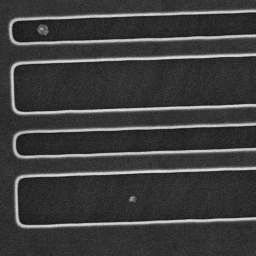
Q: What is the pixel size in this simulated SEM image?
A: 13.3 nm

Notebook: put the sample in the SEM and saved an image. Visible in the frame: groups of lines, slits or small figures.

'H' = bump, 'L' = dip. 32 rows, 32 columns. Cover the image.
HHHHHHHHHHHHHHHHHHHHHHHHHHHHHHHH
HHHHHHHHHHHHHHHHHHHHHHHHHHHLLLLL
HHLLLLLLLLLLLLLLLLLLLLLLLLLLLLLL
HLLLLLLLLLLLLLLLLLLLLLLLLLLLLLLL
HLLLLLLLLLLLLLLLLLLLLLLLLLLLLLLL
HHHHHHHHHHHHHHHHHHHHHHHHHHHHHHHH
HHHHHHHHHHHHHHHHHHHHHHHHHHHHHHHH
HHHHHHHHHHHHLLLLLLLLLLLLLLLLLLLL
HHLLLLLLLLLLLLLLLLLLLLLLLLLLLLLL
HHLLLLLLLLLLLLLLLLLLLLLLLLLLLLLL
HHLLLLLLLLLLLLLLLLLLLLLLLLLLLLLL
HHLLLLLLLLLLLLLLLLLLLLLLLLLLLLLL
HHLLLLLLLLLLLLLLLLLLLLLLLLLLLLLL
HHLLLLLLLLLLLLLLLLLLLLLLHHHHHHHH
HHHHHHHHHHHHHHHHHHHHHHHHHHHHHHHH
HHHHHHHHHHHHHHHHHHHHHHHHHHHHHHHH
HHHHLLLLLLLLLLLLLLLLLLLLLLLLLLLL
HHLLLLLLLLLLLLLLLLLLLLLLLLLLLLLL
HHLLLLLLLLLLLLLLLLLLLLLLLLLLLLLL
HHLLLLLLLHHHHHHHHHHHHHHHHHHHHHHH
HHHHHHHHHHHHHHHHHHHHHHHHHHHHHHHH
HHHHHHHHHHHHHHHHHLLLLLLLLLLLLLLL
HHLLLLLLLLLLLLLLLLLLLLLLLLLLLLLL
HHLLLLLLLLLLLLLLLLLLLLLLLLLLLLLL
HHLLLLLLLLLLLLLLLLLLLLLLLLLLLLLL
HHLLLLLLLLLLLLLLLLLLLLLLLLLLLLLL
HHLLLLLLLLLLLLLLLLLLLLLLLLLLLLLL
HHLLLLLLLLLLLLLLLLLLLLLLLLLHHHHH
HHHHHHHHHHHHHHHHHHHHHHHHHHHHHHHH
HHHHHHHHHHHHHHHHHHHHHHHHHHHHHHHH
HHHHHHHHHHHHHHHHHHHHHHHHHHHHHHHH
HHHHHHHHHHHHHHHHHHHHHHHHHHHHHHHH